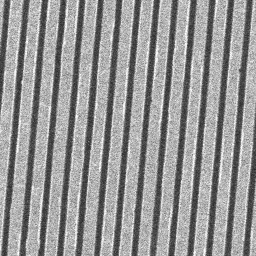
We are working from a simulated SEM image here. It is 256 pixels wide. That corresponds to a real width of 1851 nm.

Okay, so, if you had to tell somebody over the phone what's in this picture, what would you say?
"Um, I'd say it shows parallel lines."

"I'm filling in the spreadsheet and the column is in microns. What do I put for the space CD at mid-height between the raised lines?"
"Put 0.045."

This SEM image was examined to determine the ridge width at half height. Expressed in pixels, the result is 12.4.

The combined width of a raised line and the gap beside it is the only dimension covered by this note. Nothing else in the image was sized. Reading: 134 nanometres